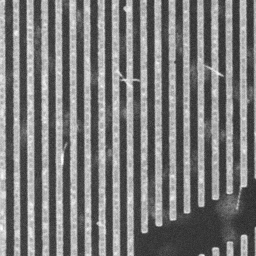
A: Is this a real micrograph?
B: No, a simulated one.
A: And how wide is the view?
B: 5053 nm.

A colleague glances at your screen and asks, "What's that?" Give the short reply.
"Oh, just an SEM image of parallel lines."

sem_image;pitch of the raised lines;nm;280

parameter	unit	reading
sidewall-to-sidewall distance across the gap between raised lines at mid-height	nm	178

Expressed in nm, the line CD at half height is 96.2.